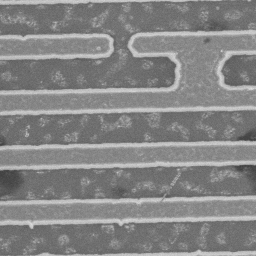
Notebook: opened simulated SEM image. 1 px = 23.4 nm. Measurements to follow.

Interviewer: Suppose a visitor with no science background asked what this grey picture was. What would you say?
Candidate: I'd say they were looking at parallel lines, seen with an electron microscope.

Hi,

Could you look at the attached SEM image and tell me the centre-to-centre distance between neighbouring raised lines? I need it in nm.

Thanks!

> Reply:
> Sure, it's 1290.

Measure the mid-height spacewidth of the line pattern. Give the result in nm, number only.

789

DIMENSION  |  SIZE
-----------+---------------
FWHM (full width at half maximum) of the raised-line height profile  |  0.506 um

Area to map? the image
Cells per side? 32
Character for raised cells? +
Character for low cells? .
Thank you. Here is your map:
................................
................................
................................
................................
........+++++....+++++++++++++++
++++++++++++++..++++++++++++++++
++++++++++++++...+++++++++++++++
......................++++++....
......................++++++....
......................++++++....
......................++++++....
....++++++++++++++++++++++++++++
++++++++++++++++++++++++++++++++
++++++++++++++++++++++++++++++++
................................
................................
................................
................................
++++++++++++++++++++++++++++++++
++++++++++++++++++++++++++++++++
++++++++++++++++++++++++..++....
................................
................................
................................
................................
++++++++++++++++++++++++++++++++
++++++++++++++++++++++++++++++++
++++++++++++++++++++....+.......
................................
................................
................................
................................